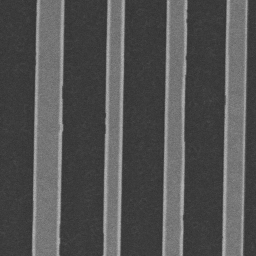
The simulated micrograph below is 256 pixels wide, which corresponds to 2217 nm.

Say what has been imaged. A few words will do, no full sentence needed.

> one or a few lines or trenches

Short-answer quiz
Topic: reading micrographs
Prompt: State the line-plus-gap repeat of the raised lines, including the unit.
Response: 0.54 um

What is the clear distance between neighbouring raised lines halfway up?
392 nm